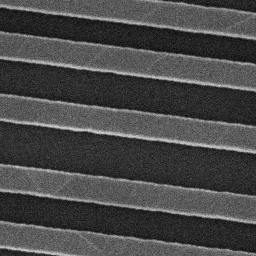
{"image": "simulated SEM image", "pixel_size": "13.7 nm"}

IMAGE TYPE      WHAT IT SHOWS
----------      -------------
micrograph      lines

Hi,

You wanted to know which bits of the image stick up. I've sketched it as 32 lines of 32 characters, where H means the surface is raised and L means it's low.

HHHHHHHHHHHHHHHHHHHHHHHLLLLLLLLL
LLLLLHHHHHHHHHHHHHHHHHHHHHHHHHHL
LLLLLLLLLLLLLHHHHHHHHHHHHHHHHHHH
LLLLLLLLLLLLLLLLLLLLLHHHHHHHHHHH
HHHHLLLLLLLLLLLLLLLLLLLLLLLLLHHH
HHHHHHHHHHHHLLLLLLLLLLLLLLLLLLLL
HHHHHHHHHHHHHHHHHHHHLLLLLLLLLLLL
LLHHHHHHHHHHHHHHHHHHHHHHHHHHLLLL
LLLLLLLLLLHHHHHHHHHHHHHHHHHHHHHH
LLLLLLLLLLLLLLLLLHHHHHHHHHHHHHHH
LLLLLLLLLLLLLLLLLLLLLLLLLLHHHHHH
LLLLLLLLLLLLLLLLLLLLLLLLLLLLLLLL
HHHHHHLLLLLLLLLLLLLLLLLLLLLLLLLL
HHHHHHHHHHHHHLLLLLLLLLLLLLLLLLLL
HHHHHHHHHHHHHHHHHHHHHHLLLLLLLLLL
LLLHHHHHHHHHHHHHHHHHHHHHHHHHHLLL
LLLLLLLLLLLHHHHHHHHHHHHHHHHHHHHH
LLLLLLLLLLLLLLLLLLLLHHHHHHHHHHHH
LLLLLLLLLLLLLLLLLLLLLLLLLLLHHHHH
LLLLLLLLLLLLLLLLLLLLLLLLLLLLLLLL
LLLLLLLLLLLLLLLLLLLLLLLLLLLLLLLL
HHHHHHHHLLLLLLLLLLLLLLLLLLLLLLLL
HHHHHHHHHHHHHHHHLLLLLLLLLLLLLLLL
HHHHHHHHHHHHHHHHHHHHHHHLLLLLLLLL
LLLLLHHHHHHHHHHHHHHHHHHHHHHHHHHL
LLLLLLLLLLLLLHHHHHHHHHHHHHHHHHHH
LLLLLLLLLLLLLLLLLLLLLHHHHHHHHHHH
LLLLLLLLLLLLLLLLLLLLLLLLLLLLLHHH
HHHHHHLLLLLLLLLLLLLLLLLLLLLLLLLL
HHHHHHHHHHHHHHHLLLLLLLLLLLLLLLLL
HHHHHHHHHHHHHHHHHHHHHHLLLLLLLLLL
LLLLHHHHHHHHHHHHHHHHHHHHHHHHHHHL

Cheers